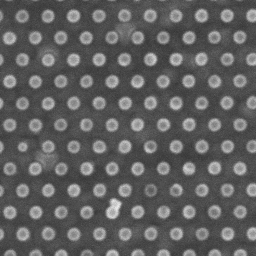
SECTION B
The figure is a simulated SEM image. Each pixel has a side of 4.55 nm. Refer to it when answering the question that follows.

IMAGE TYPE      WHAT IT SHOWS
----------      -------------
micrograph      a regular array of raised bodies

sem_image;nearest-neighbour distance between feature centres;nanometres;114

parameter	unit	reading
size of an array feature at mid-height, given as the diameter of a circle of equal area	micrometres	0.0528